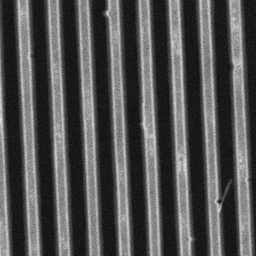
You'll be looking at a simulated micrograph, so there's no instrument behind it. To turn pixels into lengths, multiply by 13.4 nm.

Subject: parallel lines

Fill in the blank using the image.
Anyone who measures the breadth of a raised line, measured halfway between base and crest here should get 173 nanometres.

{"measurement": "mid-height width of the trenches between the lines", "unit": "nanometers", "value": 243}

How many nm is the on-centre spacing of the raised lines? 406